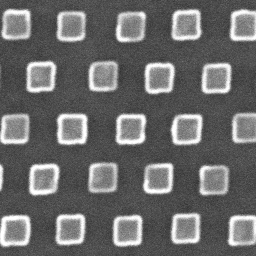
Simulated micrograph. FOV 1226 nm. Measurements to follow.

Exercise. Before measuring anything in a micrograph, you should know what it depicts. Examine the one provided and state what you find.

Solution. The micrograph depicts a regular array of raised bodies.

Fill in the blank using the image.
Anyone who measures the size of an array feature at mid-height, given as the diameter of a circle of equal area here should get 0.147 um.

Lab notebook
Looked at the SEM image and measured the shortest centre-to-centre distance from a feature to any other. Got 0.268 microns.